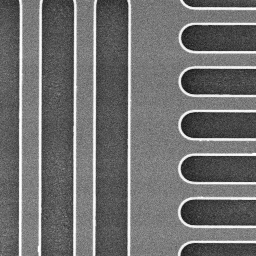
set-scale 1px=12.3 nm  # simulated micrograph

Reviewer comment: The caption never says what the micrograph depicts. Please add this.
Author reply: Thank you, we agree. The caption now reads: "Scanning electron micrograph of groups of lines, slits or small figures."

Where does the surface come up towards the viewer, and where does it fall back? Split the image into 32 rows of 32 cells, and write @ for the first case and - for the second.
--@@@----@@@----@@@@@@@---------
---@@----@@@----@@@@@@@@@@@@@@@@
---@@----@@@----@@@@@@@@@@@@@@@@
---@@----@@@----@@@@@@@---------
---@@----@@@----@@@@@@@---------
---@@----@@@----@@@@@@@---------
---@@----@@@----@@@@@@@@@-------
---@@----@@@----@@@@@@@@@@@@@@@@
---@@----@@@----@@@@@@@@--------
---@@----@@@----@@@@@@@---------
---@@----@@@----@@@@@@@---------
---@@----@@@----@@@@@@@---------
---@@----@@@----@@@@@@@@@@@@@@@@
---@@----@@@----@@@@@@@@@@@@@@@@
---@@----@@@----@@@@@@@---------
---@@----@@@----@@@@@@----------
---@@----@@@----@@@@@@@---------
---@@----@@@----@@@@@@@@@@@@@@@@
---@@----@@@----@@@@@@@@@@@@@@@@
---@@----@@@----@@@@@@@@--------
---@@----@@@----@@@@@@@---------
---@@----@@@----@@@@@@@---------
---@@----@@@----@@@@@@@---------
---@@----@@@----@@@@@@@@@@@@@@@@
---@@----@@@----@@@@@@@@@@@@@@@@
---@@----@@@----@@@@@@@---------
---@@----@@@----@@@@@@----------
---@@----@@@----@@@@@@@---------
--@@@----@@@----@@@@@@@@@@@@@@@@
--@@@----@@@----@@@@@@@@@@@@@@@@
--@@@----@@@----@@@@@@@---------
--@@@----@@@----@@@@@@@---------